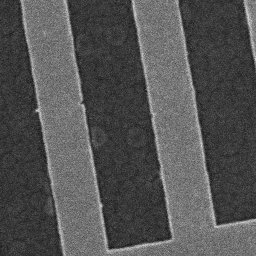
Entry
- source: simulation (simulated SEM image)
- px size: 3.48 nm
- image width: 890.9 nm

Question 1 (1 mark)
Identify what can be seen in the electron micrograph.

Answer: one or a few lines or trenches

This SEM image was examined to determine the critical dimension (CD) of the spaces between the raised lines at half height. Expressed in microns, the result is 0.23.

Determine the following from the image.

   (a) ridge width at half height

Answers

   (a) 155 nm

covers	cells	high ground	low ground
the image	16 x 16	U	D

DUUUDDDDUUUDDDDU
DDUUDDDDDUUDDDDD
DDUUUDDDDUUUDDDD
DDUUUDDDDUUUDDDD
DDUUUDDDDUUUDDDD
DDUUUDDDDUUUDDDD
DDUUUDDDDUUUDDDD
DDDUUDDDDDUUDDDD
DDDUUUDDDDUUUDDD
DDDUUUDDDDUUUDDD
DDDUUUDDDDUUUDDD
DDDUUUDDDDUUUDDD
DDDUUUDDDDUUUDDD
DDDDUUDDDDDUUDDD
DDDDUUUDDDDUUUUU
DDDDUUUDUUUUUUUU